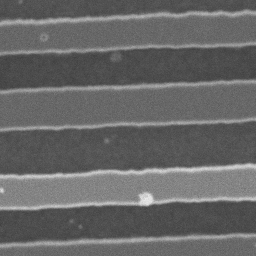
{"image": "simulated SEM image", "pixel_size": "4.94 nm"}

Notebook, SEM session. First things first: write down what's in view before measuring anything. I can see lines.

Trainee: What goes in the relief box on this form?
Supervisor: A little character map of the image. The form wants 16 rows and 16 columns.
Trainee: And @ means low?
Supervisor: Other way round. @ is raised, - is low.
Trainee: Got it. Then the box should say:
----------------
@@@@@@@@@@@@@@@@
@@@@@@@@@@@@@@@@
----------------
----------------
---@@@@@@@@@@@@@
@@@@@@@@@@@@@@@@
@@@@@@@@@@@@@@@@
----------------
----------------
-------------@@@
@@@@@@@@@@@@@@@@
@@@@@@@@@@@@@@@@
----------------
----------------
@@@@@@@@@@@@@@@@